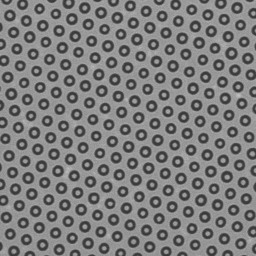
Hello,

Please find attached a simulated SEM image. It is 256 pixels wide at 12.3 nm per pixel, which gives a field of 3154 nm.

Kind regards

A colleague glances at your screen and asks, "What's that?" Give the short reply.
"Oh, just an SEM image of a regular array of ring-shaped grooves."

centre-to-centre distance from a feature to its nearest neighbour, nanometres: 206